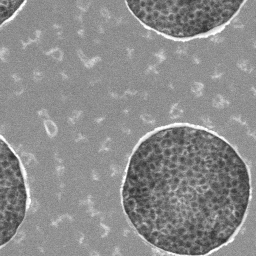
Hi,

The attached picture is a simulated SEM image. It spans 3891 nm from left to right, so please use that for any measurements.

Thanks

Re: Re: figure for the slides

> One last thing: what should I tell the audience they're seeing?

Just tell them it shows holes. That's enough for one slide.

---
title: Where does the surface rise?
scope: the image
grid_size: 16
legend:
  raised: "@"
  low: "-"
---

-@@@@@@@-------@
@@@@@@@@@-----@@
@@@@@@@@@@@@@@@@
@@@@@@@@@@@@@@@@
@@@@@@@@@@@@@@@@
@@@@@@@@@@@@@@@@
@@@@@@@@@@@@@@@@
@@@@@@@@@@@@@@@@
@@@@@@@@@-----@@
-@@@@@@@-------@
-@@@@@@@-------@
--@@@@@@--------
--@@@@@@--------
--@@@@@@-------@
-@@@@@@@@------@
@@@@@@@@@@----@@